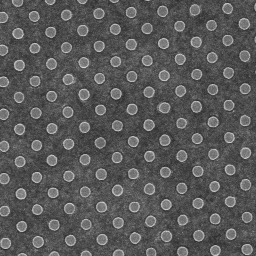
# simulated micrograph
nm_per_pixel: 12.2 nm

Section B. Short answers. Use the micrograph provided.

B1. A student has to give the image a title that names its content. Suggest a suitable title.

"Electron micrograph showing a regular array of raised bodies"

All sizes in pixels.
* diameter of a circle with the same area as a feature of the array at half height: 10.4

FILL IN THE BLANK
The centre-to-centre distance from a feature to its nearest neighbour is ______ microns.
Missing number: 0.269